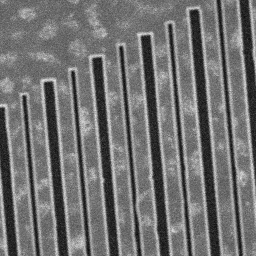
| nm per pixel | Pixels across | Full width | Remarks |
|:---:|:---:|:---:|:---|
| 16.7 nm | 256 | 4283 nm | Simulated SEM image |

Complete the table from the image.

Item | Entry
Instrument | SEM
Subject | parallel lines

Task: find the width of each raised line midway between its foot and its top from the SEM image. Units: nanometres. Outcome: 265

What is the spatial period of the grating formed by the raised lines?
416 nm